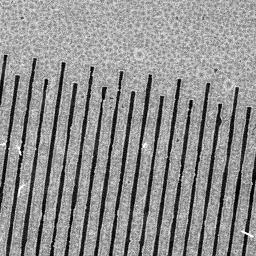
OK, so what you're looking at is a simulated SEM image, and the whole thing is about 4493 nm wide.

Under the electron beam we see parallel lines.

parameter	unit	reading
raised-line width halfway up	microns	0.174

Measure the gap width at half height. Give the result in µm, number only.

0.076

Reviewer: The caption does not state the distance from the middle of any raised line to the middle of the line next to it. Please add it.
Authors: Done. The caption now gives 256 nm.